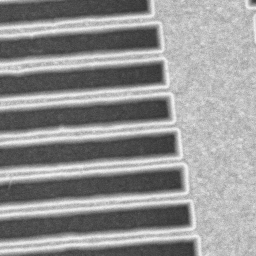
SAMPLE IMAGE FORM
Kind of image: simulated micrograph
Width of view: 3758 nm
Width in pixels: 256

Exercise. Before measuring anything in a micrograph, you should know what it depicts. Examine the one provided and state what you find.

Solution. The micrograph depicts parallel lines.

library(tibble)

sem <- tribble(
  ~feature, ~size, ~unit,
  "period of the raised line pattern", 0.527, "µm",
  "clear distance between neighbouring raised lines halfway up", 333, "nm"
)